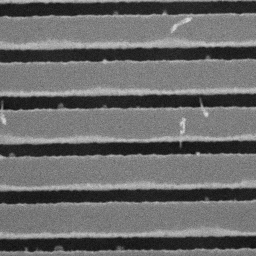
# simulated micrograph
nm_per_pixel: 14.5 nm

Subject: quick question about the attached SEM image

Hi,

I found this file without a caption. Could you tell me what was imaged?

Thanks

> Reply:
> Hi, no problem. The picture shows lines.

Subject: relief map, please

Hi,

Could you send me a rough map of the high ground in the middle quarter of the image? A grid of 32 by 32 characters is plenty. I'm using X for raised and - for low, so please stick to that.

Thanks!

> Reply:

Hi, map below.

XXXXXXXXXXXXXXXXXXXXXXXXXXXXXXXX
XXXXXXXXXXXXXXXXXXXXXXXXXXXXXXXX
XXXXXXXXXXXXXXXXXXXXXXXXXXXXXXXX
XXXXXXXXXXXXXXXXXXXXXXXXXXXXXXXX
XXXXXXXXXXXXXXXXXXXXXXXXXXXXXXXX
XXXXXXXXXXXXXXXXXXXXXXXXXXXXXXXX
XXXXXXXXXXXXXXXXXXXXXXXXXXXXXXXX
XX------------------------------
--------------------------------
--------------------------------
--------------------------------
XXXXXXXXXXXXXXXXXXXXXXXXXXXXXXXX
XXXXXXXXXXXXXXXXXXXXXXXXXXXXXXXX
XXXXXXXXXXXXXXXXXXXXXXXXXXXXXXXX
XXXXXXXXXXXXXXXXXXXXXXXXXXXXXXXX
XXXXXXXXXXXXXXXXXXXXXXXXXXXXXXXX
XXXXXXXXXXXXXXXXXXXXXXXXXXXXXXXX
XXXXXXXXXXXXXXXXXXXXXXXXXXXXXXXX
XXXXXXXXXXXXXXXXXXXXXXXXXXXXXXXX
--------------------------------
--------------------------------
--------------------------------
--------------------------------
XXXXXXXXXXXXXXXXXXXXXXXXXXXXXXXX
XXXXXXXXXXXXXXXXXXXXXXXXXXXXXXXX
XXXXXXXXXXXXXXXXXXXXXXXXXXXXXXXX
XXXXXXXXXXXXXXXXXXXXXXXXXXXXXXXX
XXXXXXXXXXXXXXXXXXXXXXXXXXXXXXXX
XXXXXXXXXXXXXXXXXXXXXXXXXXXXXXXX
XXXXXXXXXXXXXXXXXXXXXXXXXXXXXXXX
XXXXXXXXXXXXXXXXXXXXXXXXXXXXXXXX
--------------------------------